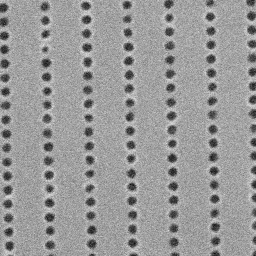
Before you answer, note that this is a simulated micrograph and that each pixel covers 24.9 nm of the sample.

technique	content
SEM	a regular array of holes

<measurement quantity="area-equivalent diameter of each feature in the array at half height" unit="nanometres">258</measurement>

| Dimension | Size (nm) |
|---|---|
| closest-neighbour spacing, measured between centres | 345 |